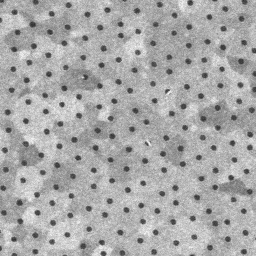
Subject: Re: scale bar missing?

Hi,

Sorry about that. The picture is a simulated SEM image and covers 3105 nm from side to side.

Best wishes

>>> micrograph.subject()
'a regular array of holes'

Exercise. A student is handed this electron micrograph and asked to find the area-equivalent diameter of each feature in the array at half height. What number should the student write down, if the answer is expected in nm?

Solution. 79.8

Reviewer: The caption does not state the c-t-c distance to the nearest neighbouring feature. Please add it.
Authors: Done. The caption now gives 205 nm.